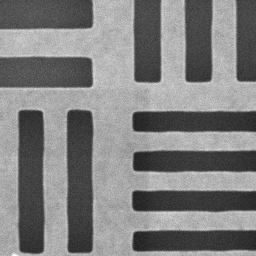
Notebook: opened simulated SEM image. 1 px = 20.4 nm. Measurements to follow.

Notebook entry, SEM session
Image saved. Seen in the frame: groups of lines, slits or small figures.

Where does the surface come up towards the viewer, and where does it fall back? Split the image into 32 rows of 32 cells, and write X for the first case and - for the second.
------------XXXXX---XXX----XX---
------------XXXXX---XXX----XX---
------------XXXXX---XXX----XX---
-----------XXXXXX---XXX----XX---
XXXXXXXXXXXXXXXXX---XXX----XX---
XXXXXXXXXXXXXXXXX---XXX----XX---
XXXXXXXXXXXXXXXXX---XXX----XX---
-----------XXXXXX---XXX----XX---
------------XXXXX---XXX----XX---
------------XXXXX---XXX----XX---
------------XXXXXXXXXXXXXXXXXXXX
XXXXXXXXXXXXXXXXXXXXXXXXXXXXXXXX
XXXXXXXXXXXXXXXXXXXXXXXXXXXXXXXX
XXXXXXXXXXXXXXXXXXXXXXXXXXXXXXXX
XX---XXX----XXXXX---------------
XX----XX----XXXX----------------
XX----XX----XXXXX---------------
XX----XX----XXXXXXXXXXXXXXXXXXXX
XX----XX----XXXXXXXXXXXXXXXXXXXX
XX---XXX----XXXXX---------------
XX---XXX----XXXXX---------------
XX---XXX----XXXXX---------------
XX---XXX----XXXXXXXXXXXXXXXXXXXX
XX---XXX----XXXXXXXXXXXXXXXXXXXX
XX----XX----XXXX----------------
XX----XX----XXXX----------------
XX----XX----XXXXX---------------
XX----XX----XXXXXXXXXXXXXXXXXXXX
XX----XX----XXXXXXXXXXXXXXXXXXXX
XX----XX----XXXXX---------------
XX----XX----XXXX----------------
XXX--XXXX--XXXXXXXXXXXXXXXXXXXXX